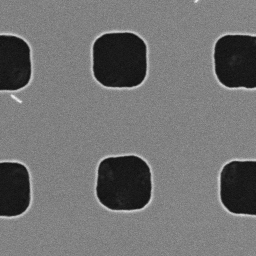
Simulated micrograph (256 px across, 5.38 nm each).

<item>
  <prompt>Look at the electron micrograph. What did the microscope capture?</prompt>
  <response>holes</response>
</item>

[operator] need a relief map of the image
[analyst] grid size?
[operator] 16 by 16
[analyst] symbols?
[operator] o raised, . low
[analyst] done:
oooooooooooooooo
oooooooooooooooo
.ooooo...ooooo..
..oooo...oooo...
..oooo...oooo...
.oooooooooooooo.
oooooooooooooooo
oooooooooooooooo
oooooooooooooooo
oooooooooooooooo
..oooo...ooooo..
..oooo...ooooo..
..oooo...ooooo..
.ooooooooooooooo
oooooooooooooooo
oooooooooooooooo